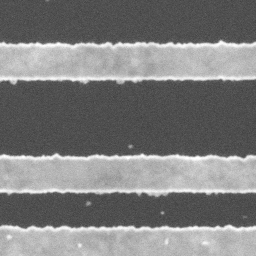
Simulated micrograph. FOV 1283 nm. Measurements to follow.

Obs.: lines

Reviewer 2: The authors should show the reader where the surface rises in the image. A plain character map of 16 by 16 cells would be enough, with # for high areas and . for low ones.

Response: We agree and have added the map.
................
................
................
################
################
................
................
................
................
................
################
################
................
................
################
################